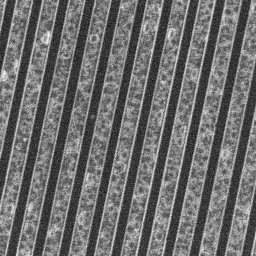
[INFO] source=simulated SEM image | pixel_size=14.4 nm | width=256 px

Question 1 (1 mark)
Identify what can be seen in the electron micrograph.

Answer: parallel lines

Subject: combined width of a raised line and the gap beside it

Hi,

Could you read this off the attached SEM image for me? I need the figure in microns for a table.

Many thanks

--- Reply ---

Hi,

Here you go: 0.368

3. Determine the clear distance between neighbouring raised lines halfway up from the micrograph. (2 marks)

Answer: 144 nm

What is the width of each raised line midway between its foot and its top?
15.4 pixels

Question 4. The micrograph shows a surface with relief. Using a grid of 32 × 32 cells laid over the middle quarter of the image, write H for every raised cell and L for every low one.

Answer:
HHLLLHHHLLLHHHHLLHHHHLLLHHHHLLLH
HLLLHHHHLLLHHHHLLHHHHLLLHHHHLLHH
HLLLHHHHLLLHHHHLLHHHHLLLHHHLLLHH
HLLLHHHHLLHHHHLLLHHHHLLHHHHLLLHH
HLLLHHHLLLHHHHLLLHHHLLLHHHHLLLHH
HLLLHHHLLLHLLHLLLHHHLLLHHHHLLLHH
LLLHHHHLLLHHHHLLHHHHLLLHHHLLLHHH
LLLHHHHLLLHHHLLLHHHHLLLHHHLLLHHH
LLLHHHHLLHHHHLLLHHHHLLHHHHLLLHHH
LLLHHHLLLHHHHLLLHHHHLLHHHHLLLHHH
LLHHHHLLLHHHHLLLHHHLLLHHHHLLLHHH
LLHHHHLLLHHHHLLHHHHLLLHHHLLLHHHH
LLHHHHLLLHHHLLLHHHHLLLHHHLLLHHHH
LLHHHLLLHHHHLLLHHHHLLHHHHLLLHHHH
LLHHHLLLHHHHLLLHHHHLLHHHHLLLHHHH
LHHHHLLLHHHHLLHHHHLLLHHHHLLHHHHL
LHHHHLLLHHHHLLHHHHLLLHHHLLLHHHHL
LHHHHLLLHHHLLLHHHHLLLHHHLLLHHHHL
LHHHLLLHHHHLLLHHHHLLHHHHLLLHHHHL
LHHHLLLHHHHLLLHHHHLLHHHHLLLHHHHL
HHHHLLLHHHHLLHHHHLLLHHHHLLHHHHLL
HHHHLLLHHHHLLHHHHLLLHHHLLLHHHHLL
HHHHLLLHHHLLLHHHHLLLHHHLLLHHHHLL
HHHLLLHHHHLLLHHHLLLHHHHLLLHHHHLL
HHHLLLHHHHLLLHHHLLLHHHHLLLHHHLLL
HHHLLLHHHHLLHHHHLLLHHHHLLHHHHLLL
HHHLLLHHHHLLHHHHLLLHHHLLLHHHHLLL
HHHLLHHHHLLLHHHHLLLHHHLLLHHHHLLL
HHLLLHHHHLLLHHHHLLHHHHLLLHHHHLLH
HHLLLHHHHLLLHHHLLLHHHHLLLHHHLLLH
HHLLLHHHHLLHHHHLLLHHHHLLHHHHLLLH
HHLLLHHHHLLHHHHLLLHHHLLLHHHHLLLH